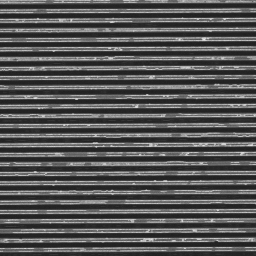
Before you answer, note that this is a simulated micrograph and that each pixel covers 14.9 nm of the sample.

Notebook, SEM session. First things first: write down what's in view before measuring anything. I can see parallel lines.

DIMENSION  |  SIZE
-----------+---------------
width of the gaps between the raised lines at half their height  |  82.2 nm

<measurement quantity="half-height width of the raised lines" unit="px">4.63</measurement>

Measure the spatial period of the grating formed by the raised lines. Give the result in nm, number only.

143